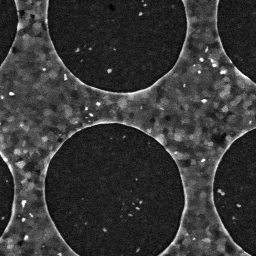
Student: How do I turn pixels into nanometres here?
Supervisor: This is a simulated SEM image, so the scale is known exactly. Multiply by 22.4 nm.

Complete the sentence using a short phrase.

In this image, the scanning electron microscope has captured holes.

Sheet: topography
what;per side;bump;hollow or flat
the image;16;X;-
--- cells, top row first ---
-XX---------XX--
-XX---------XX--
-XX---------XX--
XXXX-------XXX--
XXXX-------XXXX-
XXXXXX---XXXXXXX
XXXXXXXXXXXXXXXX
XXXXXXXXXXXXXXXX
XXXX-----XXXXXX-
XXXX-------XXX--
-XX--------XXX--
-XX--------XX---
-XX---------X---
-XX--------XXX--
XXXX-------XXX--
XXXX------XXXXX-